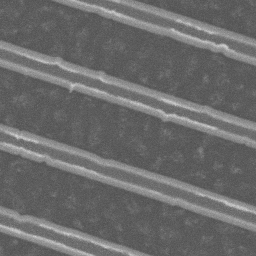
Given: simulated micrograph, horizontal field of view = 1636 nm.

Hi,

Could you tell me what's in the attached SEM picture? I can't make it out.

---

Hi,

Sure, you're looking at one or a few lines or trenches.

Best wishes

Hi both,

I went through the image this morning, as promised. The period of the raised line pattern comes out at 79.2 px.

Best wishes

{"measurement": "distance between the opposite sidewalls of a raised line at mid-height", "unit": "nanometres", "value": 115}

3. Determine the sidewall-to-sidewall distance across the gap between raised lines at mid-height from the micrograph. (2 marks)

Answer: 390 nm